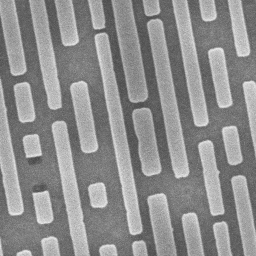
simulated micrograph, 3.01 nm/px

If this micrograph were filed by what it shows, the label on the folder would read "parallel lines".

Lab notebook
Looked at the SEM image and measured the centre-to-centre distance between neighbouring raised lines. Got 84.5 nanometers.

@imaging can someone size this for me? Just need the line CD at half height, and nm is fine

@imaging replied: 43.7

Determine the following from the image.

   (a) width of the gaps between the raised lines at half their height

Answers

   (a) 37.8 nm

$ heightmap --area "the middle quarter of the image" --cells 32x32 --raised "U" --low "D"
DDDDDDDDDUUUDDDUUUUUDDDUUUDDDDUU
DDDDDDDDDUUUDDDUUUUUDDDUUUUDDDUU
DDDDDDDDDDUUUDDUUUUUDDDUUUUDDDUU
DDDDDDDDDDUUUDDUUUUUDDDUUUUDDDDU
DDDDUDDDDDUUUDDDUUUUDDDUUUUDDDDU
DDUUUUDDDDUUUDDDUUUUUDDDUUUDDDDU
DDUUUUDDDDUUUDDDUUUUUDDDUUUUDDDU
DDUUUUDDDDUUUUDDUUUUUDDDUUUUDDDU
DDUUUUDDDDUUUUDDUUUUUDDDUUUUDDDU
DDUUUUDDDDDUUUDDDUUDDDDDUUUUDDDD
DDUUUUUDDDDUUUDDDDDDDDDDUUUUDDDD
DDDUUUUDDDDUUUDDDDUUUDDDDUUUDDDD
DDDUUUUDDDDUUUDDDUUUUUDDDUUUUDDD
DDDUUUUDDDDUUUUDDUUUUUDDDUUUUDDD
DDDUUUUDDDDDUUUDDUUUUUDDDUUUUDDD
UDDUUUUDDDDDUUUDDDUUUUDDDUUUUDDD
UDDDUUUUDDDDUUUDDDUUUUUDDDUUUDDD
UDDDUUUUDDDDUUUDDDUUUUUDDDUUUUDD
UDDDUUUUDDDDUUUUDDUUUUUDDDUUUUDD
UDDDUUUUDDDDUUUUDDDUUUUDDDUUUUDD
UDDDUUUUDDDDDUUUDDDUUUUDDDUUUUDD
UUDDUUUUDDDDDUUUDDDUUUUDDDUUUUDD
UUDDDDDDDDDDDUUUDDDUUUUUDDDUUUDD
UUDDDDDDDDDDDUUUDDDUUUUUDDDUUUUD
UUDDDDDDDDDDDUUUUDDUUUUUDDDUUUUD
UUDDDDDDDDDDDUUUUDDUUUUUDDDUUUUD
UUUDDDDDDDDDDDUUUDDDUUUUDDDUUUUD
UUUDDDDDDDDDDDUUUDDDUUDDDDDDUUUD
UUUDDDDDDDDDDDUUUDDDDDDDDDDDDDDD
UUUDDDDDDDDDDDUUUDDDDDDDDDDDDDDD
UUUDDDUUUUDDDDDUUUDDDDDDDDDDDDDD
UUUDDDUUUUDDDDDUUUDDDDDDDDDDDDDD